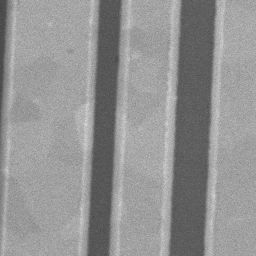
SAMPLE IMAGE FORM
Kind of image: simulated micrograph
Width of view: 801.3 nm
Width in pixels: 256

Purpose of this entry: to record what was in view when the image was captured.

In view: one or a few lines or trenches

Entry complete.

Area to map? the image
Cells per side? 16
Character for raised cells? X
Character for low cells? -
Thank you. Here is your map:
-XXXXX--XXX---XX
-XXXXX--XXX---XX
-XXXXX--XXX---XX
-XXXXX--XXX---XX
-XXXXX--XXX---XX
XXXXXX--XXX---XX
XXXXXX--XXX--XXX
XXXXXX--XXX--XXX
XXXXXX-XXXX--XXX
XXXXX--XXXX--XXX
XXXXX--XXXX--XXX
XXXXX--XXX---XXX
XXXXX--XXX---XXX
XXXXX--XXX---XXX
XXXXX--XXX---XXX
XXXXX--XXX---XXX